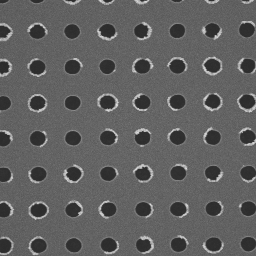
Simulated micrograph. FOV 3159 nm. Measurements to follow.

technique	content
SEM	a regular array of holes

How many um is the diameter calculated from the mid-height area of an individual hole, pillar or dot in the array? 0.184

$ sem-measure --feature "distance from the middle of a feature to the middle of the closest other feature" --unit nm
429